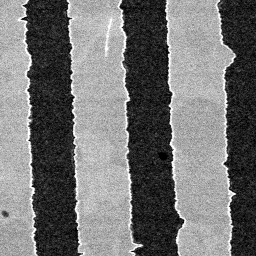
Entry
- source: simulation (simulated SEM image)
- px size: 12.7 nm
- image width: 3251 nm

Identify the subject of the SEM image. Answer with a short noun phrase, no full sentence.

one or a few lines or trenches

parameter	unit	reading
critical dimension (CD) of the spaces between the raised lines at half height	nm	564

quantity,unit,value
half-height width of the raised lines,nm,677